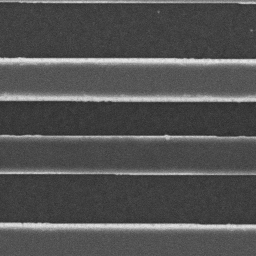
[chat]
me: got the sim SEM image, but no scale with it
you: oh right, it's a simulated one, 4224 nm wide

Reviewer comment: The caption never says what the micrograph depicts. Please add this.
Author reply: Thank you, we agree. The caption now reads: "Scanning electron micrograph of lines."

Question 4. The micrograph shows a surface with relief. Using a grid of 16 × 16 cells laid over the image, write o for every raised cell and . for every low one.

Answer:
................
................
................
................
oooooooooooooooo
oooooooooooooooo
................
................
ooo.......o.....
oooooooooooooooo
oooooooooooooooo
................
................
................
oooooooooooooooo
oooooooooooooooo